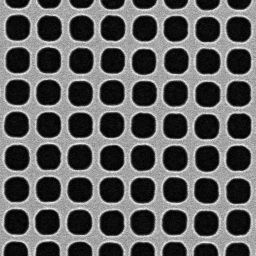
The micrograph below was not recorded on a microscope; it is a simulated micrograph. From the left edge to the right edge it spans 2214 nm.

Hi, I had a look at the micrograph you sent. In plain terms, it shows a regular array of holes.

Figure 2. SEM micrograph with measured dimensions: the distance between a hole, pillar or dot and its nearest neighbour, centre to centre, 271 nanometers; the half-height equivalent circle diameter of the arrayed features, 25.5 pixels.